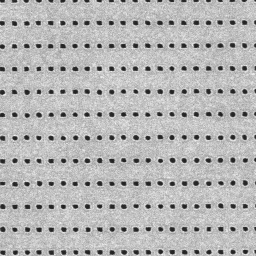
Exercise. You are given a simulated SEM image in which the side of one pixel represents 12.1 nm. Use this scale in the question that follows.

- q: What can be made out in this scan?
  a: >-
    a regular array of holes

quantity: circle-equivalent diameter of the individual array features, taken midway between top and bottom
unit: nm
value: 68.2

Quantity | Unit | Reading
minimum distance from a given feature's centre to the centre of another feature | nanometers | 143